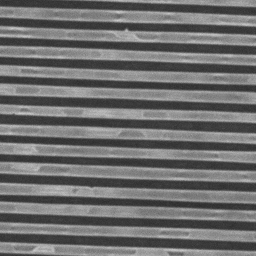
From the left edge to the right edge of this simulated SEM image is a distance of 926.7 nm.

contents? parallel lines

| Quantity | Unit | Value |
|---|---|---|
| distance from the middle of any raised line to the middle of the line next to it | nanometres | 70.9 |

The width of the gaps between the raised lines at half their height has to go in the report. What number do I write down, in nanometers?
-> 34.4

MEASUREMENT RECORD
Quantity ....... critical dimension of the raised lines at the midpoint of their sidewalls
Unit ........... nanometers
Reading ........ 37.1